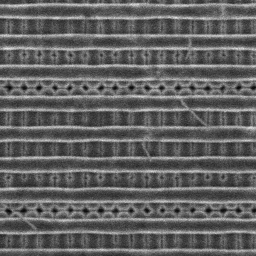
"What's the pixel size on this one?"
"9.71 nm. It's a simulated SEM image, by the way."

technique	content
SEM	wiring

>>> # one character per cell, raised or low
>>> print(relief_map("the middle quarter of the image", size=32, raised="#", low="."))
#####....##########.....####...#
################################
################################
################################
................................
................................
................................
................................
################################
################################
################################
##############################.#
................................
................................
................................
................................
################################
################################
################################
................................
................................
................................
................................
#####.......####################
################################
################################
################################
................................
................................
................................
................................
################################